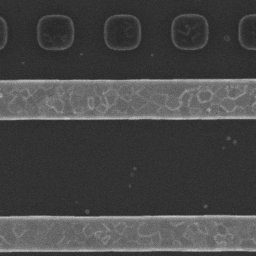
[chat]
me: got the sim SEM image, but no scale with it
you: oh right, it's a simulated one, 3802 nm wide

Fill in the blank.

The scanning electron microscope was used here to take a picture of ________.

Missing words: wiring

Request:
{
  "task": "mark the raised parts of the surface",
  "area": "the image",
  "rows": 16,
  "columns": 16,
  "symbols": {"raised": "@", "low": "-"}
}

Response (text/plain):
----------------
--@@---@@--@@--@
--@@@--@@--@@--@
----------------
----------------
@@@@@@@@@@@@@@@@
@@@@@@@@@@@@@@@@
----------------
----------------
----------------
----------------
----------------
----------------
------------@@@-
@@@@@@@@@@@@@@@@
@@@@@@@@@@@@@@@@